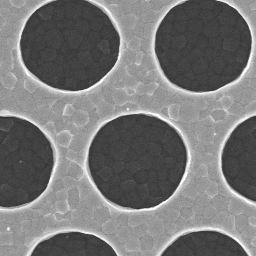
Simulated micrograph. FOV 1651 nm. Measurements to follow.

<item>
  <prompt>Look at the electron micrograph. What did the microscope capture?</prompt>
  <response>holes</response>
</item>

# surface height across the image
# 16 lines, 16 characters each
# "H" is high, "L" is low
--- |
HHLLLLHHHHHLLLLH
HHLLLLLHHHLLLLLH
HLLLLLLHHHLLLLLL
HLLLLLLHHHLLLLLL
HHLLLLLHHHLLLLLH
HHHLLHHHHHHLLLHH
HHHHHHHHHHHHHHHH
LLHHHHHLLLHHHHHL
LLLHHHLLLLLHHHLL
LLLHHHLLLLLLHHLL
LLLHHLLLLLLLHHLL
LLLHHHLLLLLHHHLL
LLHHHHHLLLHHHHHH
HHHHHHHHHHHHHHHH
HHHHHHHHHHHHLLHH
HHLLLLLHHHLLLLLH